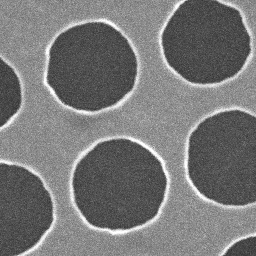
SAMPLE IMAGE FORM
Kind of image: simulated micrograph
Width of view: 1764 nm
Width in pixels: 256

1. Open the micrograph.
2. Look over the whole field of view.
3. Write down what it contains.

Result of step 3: holes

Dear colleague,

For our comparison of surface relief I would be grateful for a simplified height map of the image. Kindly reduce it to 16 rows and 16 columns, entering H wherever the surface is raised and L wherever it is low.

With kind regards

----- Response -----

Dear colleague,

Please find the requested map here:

HHHHHHHHHHHLLLLH
HHHHHLLHHHLLLLLH
HHHLLLLLHHLLLLLL
HHHLLLLLHHLLLLLL
LHHLLLLLLHHLLLLH
LHHLLLLLHHHHHHHH
LHHHLLLHHHHHHHHH
LHHHHHHHHHHHHLLL
HHHHHHHHHHHHLLLL
HHHHHLLLLHHHLLLL
LLHHHLLLLLHHLLLL
LLLHHLLLLLHHLLLL
LLLHHLLLLLHHHLLL
LLLHHLLLLLHHHHHH
LLLHHHHHHHHHHHHH
LLHHHHHHHHHHHHLL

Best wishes